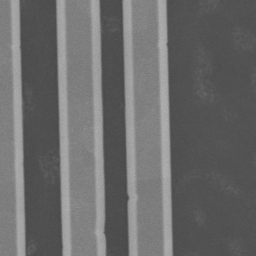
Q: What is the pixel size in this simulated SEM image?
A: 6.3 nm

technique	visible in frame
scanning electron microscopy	one or a few lines or trenches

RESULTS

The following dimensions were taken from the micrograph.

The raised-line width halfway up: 0.215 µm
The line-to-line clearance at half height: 40.2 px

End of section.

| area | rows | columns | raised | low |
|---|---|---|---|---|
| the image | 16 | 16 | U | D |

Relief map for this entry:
UDDDUUDDUUDDDDDD
UDDDUUDDUUDDDDDD
UDDDUUDDUUDDDDDD
UDDDUUDDUUDDDDDD
UDDDUUDDUUDDDDDD
UDDDUUDDUUDDDDDD
UDDDUUDDUUDDDDDD
UDDDUUDDUUDDDDDD
UDDDUUDDUUDDDDDD
UDDDUUDDUUDDDDDD
UDDDUUDDUUDDDDDD
UDDDUUDDUUDDDDDD
UDDDUUDDUUDDDDDD
UDDDUUDDUUDDDDDD
UDDDUUDDUUDDDDDD
UDDDUUDDUUDDDDDD